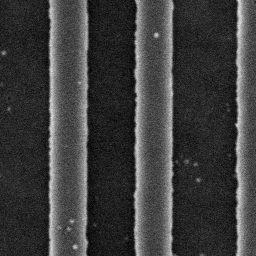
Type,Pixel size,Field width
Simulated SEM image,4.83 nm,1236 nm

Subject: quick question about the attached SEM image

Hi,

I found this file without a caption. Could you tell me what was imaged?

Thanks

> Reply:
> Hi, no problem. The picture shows lines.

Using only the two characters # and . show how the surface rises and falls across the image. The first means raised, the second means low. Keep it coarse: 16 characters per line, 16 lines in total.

...##....##....#
...##....##....#
...##...###....#
...##...###....#
...##...###....#
...##...###....#
...##...###....#
...##...###....#
...##...###....#
...##...###....#
...##...###....#
...##...###....#
...##...###....#
...##...###....#
...##...###....#
...##...###....#